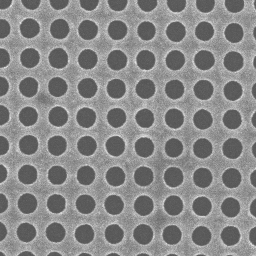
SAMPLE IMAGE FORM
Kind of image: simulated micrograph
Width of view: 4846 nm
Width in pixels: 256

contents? a regular array of holes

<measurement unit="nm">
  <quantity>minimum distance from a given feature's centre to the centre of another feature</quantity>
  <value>540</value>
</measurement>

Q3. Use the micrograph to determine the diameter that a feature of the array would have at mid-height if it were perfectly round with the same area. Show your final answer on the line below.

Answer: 0.38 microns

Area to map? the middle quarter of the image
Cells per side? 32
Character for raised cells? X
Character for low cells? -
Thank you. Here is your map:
XXXX----XXX-----XXX---XXXX----XX
XXXXXXXXXXXX--XXXXXXXXXXXXX-XXXX
XXXXXXXXXXXXXXXXXXXXXXXXXXXXXXXX
XXXXXX-XXXXXXXXXXXXXXXXXXXXXXXXX
-XXX----XXX----XXXX---XXXX----XX
-XX-----XXX----XXX-----XX-----XX
-XX-----XXX-----XX-----XX-----XX
XXXX----XXX----XXX-----XX-----XX
XXXXX-XXXXXX--XXXXX--XXXXX---XXX
XXXXXXXXXXXXXXXXXXXXXXXXXXXXXXXX
XXXXXXXXXXXXXXXXXXXXXXXXXXXXXXXX
XXXX---XXXX----XXXX--XXXXX---XXX
-XX-----XXX-----XX----XXX-----XX
-XX-----XXX-----XX----XXX-----XX
-XX-----XXX-----XX----XXX-----XX
XXXX---XXXXX--XXXXX---XXXX---XXX
XXXXXXXXXXXXXXXXXXXXXXXXXXXXXXXX
XXXXXXXXXXXXXXXXXXXXXXXXXXXXXXXX
XXXX---XXXX---XXXXX--XXXXXXXXXXX
-XX-----XX-----XXX----XXXX---XXX
-XX-----XX-----XXX-----XX-----XX
-XX-----XXX----XXX-----XX-----XX
XXXX---XXXX---XXXX----XXXX---XXX
XXXXXXXXXXXXXXXXXXXX-XXXXXXXXXXX
XXXXXXXXXXXXXXXXXXXXXXXXXXXXXXXX
XXXXX-XXXXXXXXXXXXXXXXXXXXXXXXXX
XXXX----XXX----XXX----XXX----XXX
-XX-----XX-----XX-----XXX-----XX
-XX-----XX-----XX-----XXX-----XX
XXXX---XXXX----XXX----XXX-----XX
XXXXXXXXXXXX--XXXXX-XXXXXX---XXX
XXXXXXXXXXXXXXXXXXXXXXXXXXXXXXXX